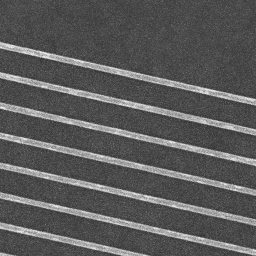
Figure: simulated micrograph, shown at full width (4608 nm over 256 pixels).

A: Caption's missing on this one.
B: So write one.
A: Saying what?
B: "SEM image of parallel lines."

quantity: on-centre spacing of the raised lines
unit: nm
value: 528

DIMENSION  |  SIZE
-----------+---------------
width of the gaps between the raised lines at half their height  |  428 nanometres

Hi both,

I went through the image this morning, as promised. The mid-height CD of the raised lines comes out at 98.8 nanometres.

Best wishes